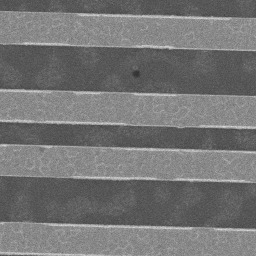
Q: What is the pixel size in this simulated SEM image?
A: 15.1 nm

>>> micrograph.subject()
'one or a few lines or trenches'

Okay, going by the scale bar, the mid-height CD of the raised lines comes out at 491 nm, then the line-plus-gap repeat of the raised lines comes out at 1.01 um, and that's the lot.